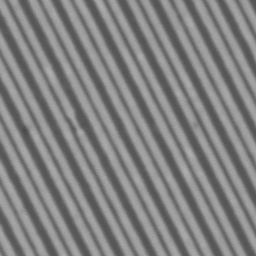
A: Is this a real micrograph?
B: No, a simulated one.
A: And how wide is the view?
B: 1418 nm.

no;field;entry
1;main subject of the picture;parallel lines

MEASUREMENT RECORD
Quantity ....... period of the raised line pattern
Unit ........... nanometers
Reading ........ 81.2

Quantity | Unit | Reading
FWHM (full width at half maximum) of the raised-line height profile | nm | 32.7